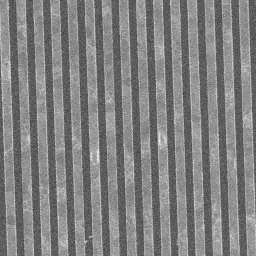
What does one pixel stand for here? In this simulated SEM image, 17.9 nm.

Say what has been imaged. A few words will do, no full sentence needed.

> parallel lines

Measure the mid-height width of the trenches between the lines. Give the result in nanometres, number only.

152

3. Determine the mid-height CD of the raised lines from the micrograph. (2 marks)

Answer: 9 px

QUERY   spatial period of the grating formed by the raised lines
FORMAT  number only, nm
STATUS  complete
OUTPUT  307